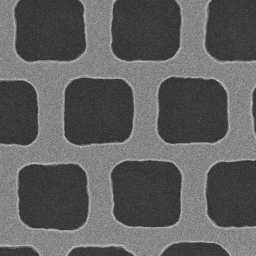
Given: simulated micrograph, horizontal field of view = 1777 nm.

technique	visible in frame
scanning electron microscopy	holes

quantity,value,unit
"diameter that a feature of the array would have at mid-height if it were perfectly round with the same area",0.512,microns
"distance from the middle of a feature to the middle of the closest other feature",651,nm